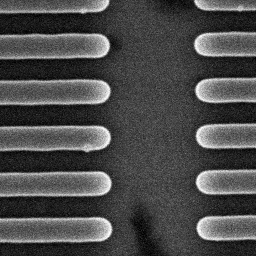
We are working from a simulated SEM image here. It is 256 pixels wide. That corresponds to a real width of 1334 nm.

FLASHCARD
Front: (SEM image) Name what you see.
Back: groups of lines, slits or small figures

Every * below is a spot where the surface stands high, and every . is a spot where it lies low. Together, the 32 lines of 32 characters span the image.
*************............*******
***.*.**..*.....................
................................
................................
...**********............*******
**************..........********
*************............*******
................................
................................
................................
*************............*******
**************...........*******
*************............*******
................................
................................
................................
*************............*******
**************...........*******
*************...................
................................
................................
..........................******
**************...........*******
**************...........*******
................................
................................
................................
*************............*******
**************...........*******
**************...........*******
................................
................................